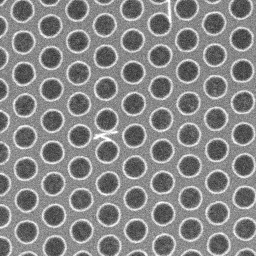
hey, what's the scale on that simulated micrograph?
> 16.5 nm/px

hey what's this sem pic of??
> a regular array of raised bodies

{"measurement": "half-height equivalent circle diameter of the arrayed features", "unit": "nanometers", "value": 386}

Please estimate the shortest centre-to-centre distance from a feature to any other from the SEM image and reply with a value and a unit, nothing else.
516 nanometres